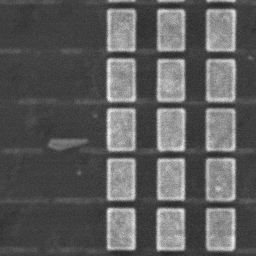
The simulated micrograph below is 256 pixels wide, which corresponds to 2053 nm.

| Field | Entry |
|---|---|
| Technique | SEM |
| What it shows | wiring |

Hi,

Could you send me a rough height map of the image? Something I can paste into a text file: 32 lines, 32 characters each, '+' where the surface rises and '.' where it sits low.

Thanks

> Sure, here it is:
................................
..............+++...+++...+++...
..............+++...+++...+++...
..............+++...+++...+++...
..............+++...+++...+++...
..............+++...+++...+++...
................................
................................
..............+++...+++...+++...
..............+++...+++...+++...
..............+++...+++...+++...
..............+++...+++...+++...
................................
................................
..............+++...+++...+++...
..............+++...+++...+++...
..............+++...+++...+++...
..............+++...+++...+++...
.......+......+++...+++...+++...
................................
..............+++...+++...+++...
..............+++...+++...+++...
..............+++...+++...+++...
..............+++...+++...+++...
..............+++...+++...+++...
................................
..............+++...+++...+++...
..............+++...+++...+++...
..............+++...+++...+++...
..............+++...+++...+++...
..............+++...+++...+++...
................................